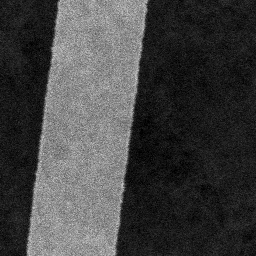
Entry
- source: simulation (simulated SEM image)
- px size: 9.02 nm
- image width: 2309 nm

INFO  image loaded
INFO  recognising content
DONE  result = one or a few lines or trenches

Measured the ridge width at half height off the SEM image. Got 86.9 px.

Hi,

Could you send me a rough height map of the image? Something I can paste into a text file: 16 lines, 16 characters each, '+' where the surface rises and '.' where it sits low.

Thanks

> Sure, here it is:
....+++++.......
....+++++.......
...++++++.......
...++++++.......
...++++++.......
...+++++........
...+++++........
...+++++........
...+++++........
..++++++........
..++++++........
..++++++........
..++++++........
..+++++.........
..+++++.........
..+++++.........